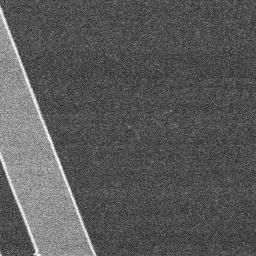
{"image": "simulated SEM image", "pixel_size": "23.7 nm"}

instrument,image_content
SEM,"one or a few lines or trenches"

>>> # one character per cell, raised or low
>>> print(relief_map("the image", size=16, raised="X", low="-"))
----------------
----------------
X---------------
X---------------
XX--------------
XX--------------
XX--------------
XXX-------------
XXX-------------
XXX-------------
XXXX------------
-XXX------------
-XXXX-----------
-XXXX-----------
--XXX-----------
--XXXX----------